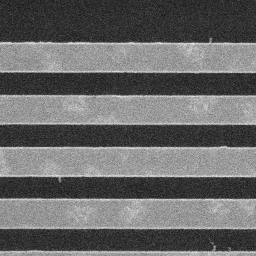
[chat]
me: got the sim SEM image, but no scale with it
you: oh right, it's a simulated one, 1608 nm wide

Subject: parallel lines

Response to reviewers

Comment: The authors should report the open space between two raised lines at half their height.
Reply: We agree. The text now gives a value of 143 nanometres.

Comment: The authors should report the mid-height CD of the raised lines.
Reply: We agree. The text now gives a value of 187 nm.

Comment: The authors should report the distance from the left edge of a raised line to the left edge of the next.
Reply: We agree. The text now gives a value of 0.327 micrometres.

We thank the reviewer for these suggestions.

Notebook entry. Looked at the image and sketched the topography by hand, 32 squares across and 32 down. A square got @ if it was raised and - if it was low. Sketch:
--------------------------------
--------------------------------
--------------------------------
--------------------------------
--------------------------------
@@@@@@@@@@@@@@@@@@@@@@@@@@@@@@@@
@@@@@@@@@@@@@@@@@@@@@@@@@@@@@@@@
@@@@@@@@@@@@@@@@@@@@@@@@@@@@@@@@
@@@@@@@@@@@@@@@@@@@@@@@@@@@@@@@@
--------------------------------
--------------------------------
--------------------------------
@@@@@@@@@@@@@@@@@@@@@@@@@@@@@@@@
@@@@@@@@@@@@@@@@@@@@@@@@@@@@@@@@
@@@@@@@@@@@@@@@@@@@@@@@@@@@@@@@@
--------------------@@@@@@@@@@@@
--------------------------------
--------------------------------
@@@@@@@@@@@@@@@@@@@@@@@@@@@@@@@@
@@@@@@@@@@@@@@@@@@@@@@@@@@@@@@@@
@@@@@@@@@@@@@@@@@@@@@@@@@@@@@@@@
@@@@@@@@@@@@@@@@@@@@@@@@@@@@@@@@
--------------------------------
--------------------------------
--------------------------------
@@@@@@@@@@@@@@@@@@@@@@@@@@@@@@@@
@@@@@@@@@@@@@@@@@@@@@@@@@@@@@@@@
@@@@@@@@@@@@@@@@@@@@@@@@@@@@@@@@
@@@@@@@@@@@@@@@@@@@@@@@@@@@@@@@@
--------------------------------
--------------------------------
@@@@@@@@@@@------------@--@-@---